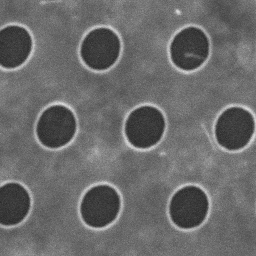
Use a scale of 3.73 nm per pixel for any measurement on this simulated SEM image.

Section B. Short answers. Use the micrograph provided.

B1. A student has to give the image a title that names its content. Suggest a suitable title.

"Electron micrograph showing holes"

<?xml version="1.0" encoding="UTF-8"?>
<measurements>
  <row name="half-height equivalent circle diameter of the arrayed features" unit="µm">0.158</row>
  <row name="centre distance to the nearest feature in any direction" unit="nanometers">331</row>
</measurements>